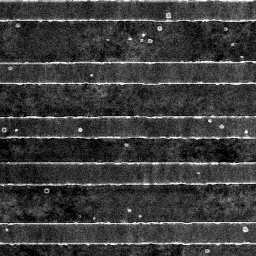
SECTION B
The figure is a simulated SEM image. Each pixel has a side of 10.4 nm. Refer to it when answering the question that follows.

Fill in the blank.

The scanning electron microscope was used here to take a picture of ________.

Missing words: lines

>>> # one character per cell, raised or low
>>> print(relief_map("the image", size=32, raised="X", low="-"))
XXXXXXXXXXXXXXXXXXXXXXXXXXXXXXXX
XXXXXXXXXXXXXXXXXXXXXXXXXXXXXXXX
XX--XXXXXXX--XX-X--XXXXXXX-XXXXX
--------------------------------
--------------------------------
--------------------------------
--------------------------------
--------------------------------
XXXXXXXXXXXXXXXXXXXXXXXXXXXXXXXX
XXXXXXXXXXXXXXXXXXXXXXXXXXXXXXXX
--------------------------------
--------------------------------
--------------------------------
--------------------------------
--------------------------------
XXXXXXXXXXXXXXXXXXXXXXXXXXXXXXXX
XXXXXXXXXXXXXXXXXXXXXXXXXXXXXXXX
--------------------------------
--------------------------------
--------------------------------
XXXXXXXXXXXXXXXXXXXXXXXXXXXXXXXX
XXXXXXXXXXXXXXXXXXXXXXXXXXXXXXXX
XXXXXXXXXXXXXXXXXXXXXXXXXXXXXXXX
--------------------------------
--------------------------------
--------------------------------
--------------------------------
--------------------------------
XXXXXXXXXXXXXXXXXXXXXXXXXXXXXXXX
XXXXXXXXXXXXXXXXXXXXXXXXXXXXXXXX
-XX----XX-XX-XX-X-----XX---X-X--
--------------------------------